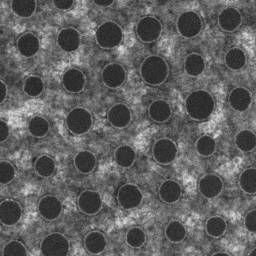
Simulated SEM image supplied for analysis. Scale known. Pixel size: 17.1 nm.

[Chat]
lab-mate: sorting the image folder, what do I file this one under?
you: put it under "a regular array of raised bodies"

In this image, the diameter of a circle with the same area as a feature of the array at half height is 417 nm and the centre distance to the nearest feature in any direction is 687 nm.